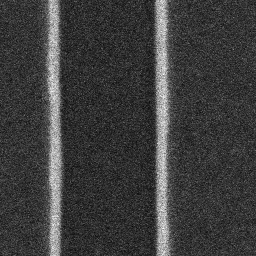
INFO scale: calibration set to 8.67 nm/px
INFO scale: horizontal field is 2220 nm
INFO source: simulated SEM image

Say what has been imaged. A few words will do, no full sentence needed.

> one or a few lines or trenches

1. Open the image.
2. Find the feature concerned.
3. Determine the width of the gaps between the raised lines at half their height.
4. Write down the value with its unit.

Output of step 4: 925 nm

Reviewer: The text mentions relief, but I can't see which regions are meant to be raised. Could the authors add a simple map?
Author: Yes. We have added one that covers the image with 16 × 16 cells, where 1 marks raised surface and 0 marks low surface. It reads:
1110000000111111
1110000000111111
1110000000111111
1110000000111111
1110000000111111
1110000000111111
1110000000111111
1110000000111111
1110000000111111
1111000000111111
1111000000111111
1110000000111111
1110000000111111
1110000000111111
1110000000111111
1110000000111111